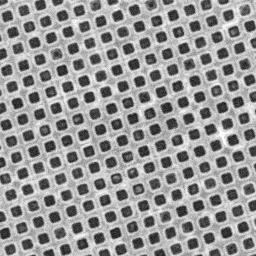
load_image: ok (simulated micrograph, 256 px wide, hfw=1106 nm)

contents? a regular array of holes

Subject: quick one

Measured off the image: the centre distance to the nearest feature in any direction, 73.2 nanometres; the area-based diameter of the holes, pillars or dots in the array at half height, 0.0528 um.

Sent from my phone